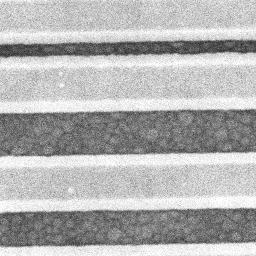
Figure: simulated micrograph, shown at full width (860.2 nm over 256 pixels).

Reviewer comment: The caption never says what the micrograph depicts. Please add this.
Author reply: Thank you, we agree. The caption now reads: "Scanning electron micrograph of one or a few lines or trenches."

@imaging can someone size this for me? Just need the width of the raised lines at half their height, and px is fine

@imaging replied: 44.3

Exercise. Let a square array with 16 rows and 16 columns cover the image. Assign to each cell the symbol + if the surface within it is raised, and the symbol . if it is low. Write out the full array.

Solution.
++++++++++++++++
++++++++++++++++
................
................
++++++++++++++++
++++++++++++++++
+++++++++++++...
................
................
................
++++++++++++++++
++++++++++++++++
++++++++++++++++
................
................
................